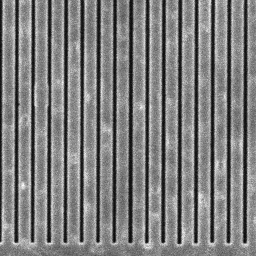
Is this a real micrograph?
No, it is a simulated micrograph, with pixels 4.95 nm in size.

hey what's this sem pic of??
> parallel lines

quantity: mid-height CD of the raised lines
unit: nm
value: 56.9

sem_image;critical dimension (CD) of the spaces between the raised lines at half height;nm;23.5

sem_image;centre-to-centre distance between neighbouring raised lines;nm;80.7